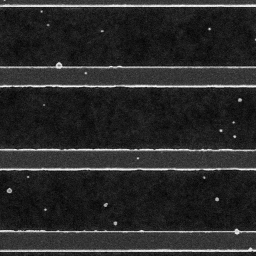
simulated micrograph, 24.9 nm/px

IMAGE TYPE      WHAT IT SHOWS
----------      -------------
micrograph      lines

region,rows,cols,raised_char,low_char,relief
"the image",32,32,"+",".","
++++++++++++++++++++++++++++++++
................................
................................
................................
................................
................................
................................
................................
++++++++++++++++++++++++++++++++
++++++++++++++++++++++++++++++++
++++++++++++++++++++++++++++++++
................................
................................
................................
................................
................................
................................
................................
................................
++++++++++++++++++++++++++++++++
++++++++++++++++++++++++++++++++
................................
................................
................................
................................
................................
................................
................................
................................
++++++++++++++++++++++++++++++++
++++++++++++++++++++++++++++++++
................................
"